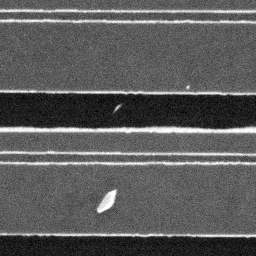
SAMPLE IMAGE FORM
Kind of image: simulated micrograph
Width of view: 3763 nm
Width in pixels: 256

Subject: lines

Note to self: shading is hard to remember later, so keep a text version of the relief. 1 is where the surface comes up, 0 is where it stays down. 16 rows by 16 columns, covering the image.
1111111111111111
1111111111111111
1111111111111111
1111111111111111
1111111111111111
1111111111111111
0000000000000000
0000000000000000
1111111111111111
1111111111111111
1111111111111111
1111111111111111
1111111111111111
1111111111111111
1111111111111111
0000000000000000